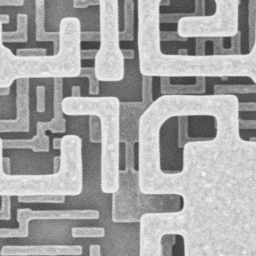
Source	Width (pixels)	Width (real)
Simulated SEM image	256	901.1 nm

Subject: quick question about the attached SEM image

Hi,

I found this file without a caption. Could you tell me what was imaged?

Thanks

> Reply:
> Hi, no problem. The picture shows wiring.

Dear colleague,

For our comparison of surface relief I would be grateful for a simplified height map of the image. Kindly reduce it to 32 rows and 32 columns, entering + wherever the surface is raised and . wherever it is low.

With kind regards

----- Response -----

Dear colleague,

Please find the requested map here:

.............++..+++.......+++..
.............++..+++.......+++..
........++...++..+++...+++++++..
........++...++..+++..++++++++..
........++...++..+++...++.......
........++...++..+++............
+......+++..+++..+++...........+
++++++++++..+++..+++++++++++++++
++++++++++..+++...++++++++++++++
+++++++++...+++......++...++...+
+...............................
................................
........+++++++.....++++++++++..
........+++++++....+++++++++++..
............+++...++++.....+++..
.............++..+++.......+++..
.............++..+++.......+++..
........++...++..+++......++++..
........++...++..+++...+++++++++
........++...++..+++...+++++++++
........++...++..+++...+++++++++
+......+++...++..+++..++++++++++
++++++++++...++..+++++++++++++++
++++++++++...++..+++++++++++++++
.......................+++++++++
.......................+++++++++
......................++++++++++
..................++++++++++++++
..................++++++++++++++
..................++...+++++++++
..................++...+++++++++
..................++...+++++++++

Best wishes